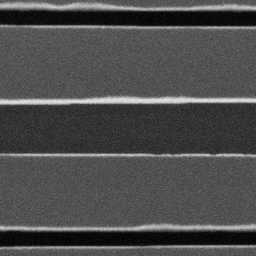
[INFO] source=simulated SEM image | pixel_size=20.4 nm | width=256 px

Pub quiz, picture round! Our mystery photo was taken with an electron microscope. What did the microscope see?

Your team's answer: lines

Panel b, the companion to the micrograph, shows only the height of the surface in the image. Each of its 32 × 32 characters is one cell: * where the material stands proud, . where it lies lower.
********************************
................................
................................
********************************
********************************
********************************
********************************
********************************
********************************
********************************
********************************
********************************
********************************
................................
................................
................................
................................
................................
................................
********************************
********************************
********************************
********************************
********************************
********************************
********************************
********************************
********************************
********************************
................................
................................
********************************